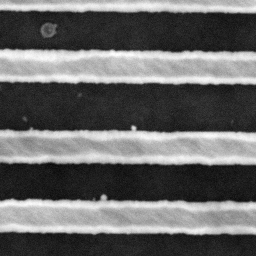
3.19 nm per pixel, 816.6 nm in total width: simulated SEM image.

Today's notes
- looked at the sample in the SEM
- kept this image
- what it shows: lines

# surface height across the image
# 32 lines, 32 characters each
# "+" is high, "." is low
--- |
++++++++++++++++++++++++++++++++
...............................+
................................
................................
................................
................................
+++++.....+++++++...............
++++++++++++++++++++++++++++++++
++++++++++++++++++++++++++++++++
++++++++++++++++++++++++++++++++
................................
................................
................................
................................
................................
................................
++.+++..+++...+.................
++++++++++++++++++++++++++++++++
++++++++++++++++++++++++++++++++
++++++++++++++++++++++++++++++++
..........................+.....
................................
................................
................................
................................
++++++++++++++++++++++++++++++++
++++++++++++++++++++++++++++++++
++++++++++++++++++++++++++++++++
++++++++++++++++++++++++++++++++
................................
................................
................................